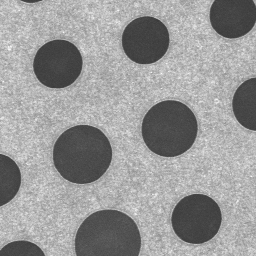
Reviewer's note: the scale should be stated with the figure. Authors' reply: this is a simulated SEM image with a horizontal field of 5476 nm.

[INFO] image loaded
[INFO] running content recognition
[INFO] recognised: holes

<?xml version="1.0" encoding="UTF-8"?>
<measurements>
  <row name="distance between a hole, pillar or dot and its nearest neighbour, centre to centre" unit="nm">1950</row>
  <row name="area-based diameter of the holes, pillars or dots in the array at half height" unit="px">50.3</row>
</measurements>